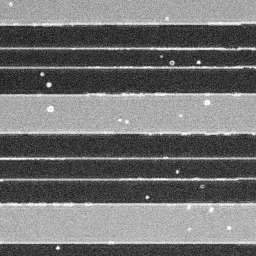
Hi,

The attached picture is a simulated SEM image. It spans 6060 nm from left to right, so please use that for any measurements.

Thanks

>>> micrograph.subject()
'lines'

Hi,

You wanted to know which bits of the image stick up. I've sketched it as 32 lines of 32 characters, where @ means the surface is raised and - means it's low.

@@@@@@@@@@@@@@@@@@@@@@@@@@@@@@@@
@@@@@@@@@@@@@@@@@@@@@@@@@@@@@@@@
@@@@@@@@@@@@@@@@@@@@@@@@@@@@@@@@
--------------------------------
--------------------------------
--------------------------------
@@@@@@@@@@@@@@@@@@@@@@@@@@@@@@@@
@@@@@@@@@@@@@@@@@@@@@@@@@@@@@@@@
--------------------------------
--------------------------------
--------------------------------
--------------------------------
@@@@@@@@@@@@@@@@@@@@@@@@@@@@@@@@
@@@@@@@@@@@@@@@@@@@@@@@@@@@@@@@@
@@@@@@@@@@@@@@@@@@@@@@@@@@@@@@@@
@@@@@@@@@@@@@@@@@@@@@@@@@@@@@@@@
@@@@@@@@@@@@@@@@@@@@@@@@@@@@@@@@
--------------------------------
--------------------------------
--------------------------------
@@@@@@@@@@@@@@@@@@@@@@@@@@@@@@@@
@@@@@@@@@@@@@@@@@@@@@@@@@@@@@@@@
--------------------------------
--------------------------------
--------------------------------
--------------------------------
@@@@@@@@@@@@@@@@@@@@@@@@@@@@@@@@
@@@@@@@@@@@@@@@@@@@@@@@@@@@@@@@@
@@@@@@@@@@@@@@@@@@@@@@@@@@@@@@@@
@@@@@@@@@@@@@@@@@@@@@@@@@@@@@@@@
--------------------------------
--------------------------------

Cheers